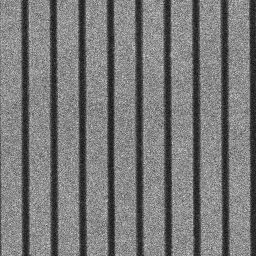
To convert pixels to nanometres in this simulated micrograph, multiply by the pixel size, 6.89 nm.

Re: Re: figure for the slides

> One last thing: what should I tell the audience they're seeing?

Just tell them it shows parallel lines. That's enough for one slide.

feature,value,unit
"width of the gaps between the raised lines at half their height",52.6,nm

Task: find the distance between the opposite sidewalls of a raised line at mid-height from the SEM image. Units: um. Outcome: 0.146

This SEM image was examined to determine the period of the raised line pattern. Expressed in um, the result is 0.197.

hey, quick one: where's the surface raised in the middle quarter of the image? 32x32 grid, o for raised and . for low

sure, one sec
oooo..ooooo..ooooo..ooooo..ooooo
oooo..ooooo..ooooo..ooooo..ooooo
oooo..ooooo..ooooo..ooooo..ooooo
oooo..ooooo..ooooo..ooooo..ooooo
oooo..ooooo..ooooo..ooooo..ooooo
oooo..ooooo..ooooo..ooooo..ooooo
ooo...ooooo..ooooo..ooooo..ooooo
ooo...ooooo..ooooo..ooooo..ooooo
ooo...ooooo..ooooo..ooooo..ooooo
ooo...ooooo..ooooo..ooooo..ooooo
oooo..ooooo..ooooo..ooooo..ooooo
oooo..ooooo..ooooo..ooooo..ooooo
oooo..ooooo..ooooo..ooooo..ooooo
oooo..ooooo..ooooo..ooooo..ooooo
oooo..ooooo..ooooo..ooooo..ooooo
oooo..ooooo..ooooo..ooooo..ooooo
oooo..ooooo..ooooo..ooooo..ooooo
oooo..ooooo..ooooo..ooooo..ooooo
oooo..ooooo..ooooo..ooooo..ooooo
ooo...ooooo..ooooo..ooooo..ooooo
ooo...ooooo..ooooo..ooooo..ooooo
oooo..ooooo..ooooo..ooooo..ooooo
oooo..ooooo..ooooo..ooooo..ooooo
oooo..ooooo..ooooo..ooooo..ooooo
oooo..ooooo..ooooo..ooooo..ooooo
oooo..ooooo..ooooo..ooooo..ooooo
oooo..ooooo..ooooo..ooooo..ooooo
oooo..ooooo..ooooo..ooooo..ooooo
oooo..ooooo..ooooo..ooooo..ooooo
oooo..ooooo..ooooo..ooooo..ooooo
oooo..ooooo..ooooo..ooooo..ooooo
oooo..ooooo..ooooo..ooooo..ooooo